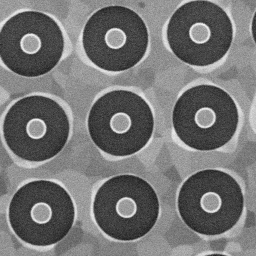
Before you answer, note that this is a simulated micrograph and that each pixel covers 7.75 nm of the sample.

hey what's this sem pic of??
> an array of small figures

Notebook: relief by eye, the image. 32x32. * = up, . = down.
***********************.....****
**...*******.....*****......****
*......****.......***........***
........**........***...**...**.
...*....**...***...**...**...***
...**...**...**....**........***
...*....**........****......****
........***.......*****.....****
*......*****....*********.******
***..***************************
************************..******
*************....******.....****
**.....*****......****.......***
*.......***........***........**
.........**...**...***..***...**
....**...**...**...***...*....**
....**...**........***........**
........****.......***.......***
*.......****......******....****
**.....******...****************
***..***************************
*************************....***
****..*******.....*****.......**
**......****.......****.......**
**.......***........**....*...**
*....*...***...**...**...**...**
*...**...***...**...**....*....*
*...**...***........***.......**
*........***.......*****......**
**......*****.....*******..*****
***....*************************
********************************